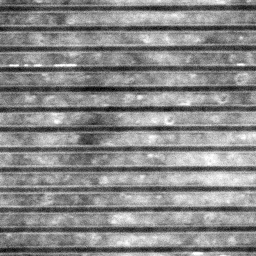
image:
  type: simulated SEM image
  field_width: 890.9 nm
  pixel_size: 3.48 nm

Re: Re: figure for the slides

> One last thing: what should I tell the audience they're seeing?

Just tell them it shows parallel lines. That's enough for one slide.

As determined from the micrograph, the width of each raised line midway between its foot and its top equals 26.9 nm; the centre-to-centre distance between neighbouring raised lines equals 69.9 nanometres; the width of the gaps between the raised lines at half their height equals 43.5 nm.